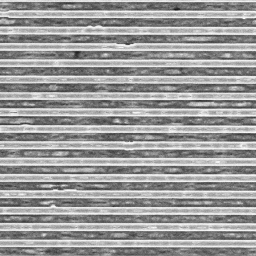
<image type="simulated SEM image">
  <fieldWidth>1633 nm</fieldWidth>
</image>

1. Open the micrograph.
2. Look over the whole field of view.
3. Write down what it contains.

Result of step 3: parallel lines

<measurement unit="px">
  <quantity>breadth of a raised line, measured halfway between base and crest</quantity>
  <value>7.74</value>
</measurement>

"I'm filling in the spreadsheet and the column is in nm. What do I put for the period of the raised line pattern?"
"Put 104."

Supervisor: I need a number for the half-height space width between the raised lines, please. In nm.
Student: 55.8